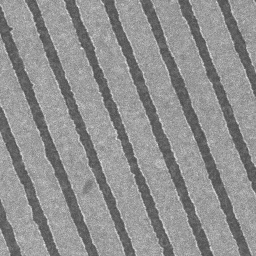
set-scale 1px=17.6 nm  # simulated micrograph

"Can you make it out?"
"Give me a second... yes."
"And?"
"parallel lines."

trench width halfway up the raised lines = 192 nm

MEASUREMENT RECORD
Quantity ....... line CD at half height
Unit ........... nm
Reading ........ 440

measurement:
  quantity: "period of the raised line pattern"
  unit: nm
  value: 626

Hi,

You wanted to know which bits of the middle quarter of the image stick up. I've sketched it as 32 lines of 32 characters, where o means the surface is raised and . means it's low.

ooooooo..ooooooo...oooooo...oooo
ooooooo...oooooo...ooooooo...ooo
ooooooo...oooooo....oooooo...ooo
.oooooo...ooooooo...oooooo....oo
.ooooooo...oooooo...ooooooo...oo
..ooooooo..ooooooo...oooooo...oo
..ooooooo...oooooo...ooooooo...o
..ooooooo...oooooo...ooooooo...o
...oooooo...ooooooo...oooooo....
.o.ooooooo...oooooo...ooooooo...
oo..oooooo...ooooooo...oooooo...
o...ooooooo...oooooo...oooooo...
o...ooooooo...ooooooo..ooooooo..
oo...oooooo...ooooooo...oooooo..
oo...ooooooo.o.oooooo...ooooooo.
ooo...oooooo...ooooooo...oooooo.
ooo...ooooooo..ooooooo...ooooooo
ooo...ooooooo...oooooo...ooooooo
oooo...oooooo...ooooooo...oooooo
oooo...ooooooo...oooooo...oooooo
ooooo...oooooo...ooooooo...ooooo
ooooo...ooooooo..ooooooo...ooooo
ooooo...ooooooo...oooooo....oooo
oooooo...oooooo...ooooooo...oooo
oooooo...ooooooo..ooooooo...oooo
oooooo...ooooooo...ooooooo...ooo
ooooooo...ooooooo..ooooooo...ooo
.oooooo...ooooooo...oooooo...ooo
.ooooooo...ooooooo..ooooooo...oo
..oooooo...ooooooo...oooooo...oo
..ooooooo..ooooooo...ooooooo...o
..ooooooo.o.oooooo....oooooo...o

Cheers